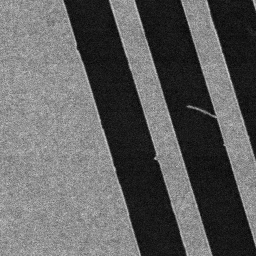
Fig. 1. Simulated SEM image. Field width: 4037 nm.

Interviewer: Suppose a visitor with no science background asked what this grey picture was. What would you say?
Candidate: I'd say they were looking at one or a few lines or trenches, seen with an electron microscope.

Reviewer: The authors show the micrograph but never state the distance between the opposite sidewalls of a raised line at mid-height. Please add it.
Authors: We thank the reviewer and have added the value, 373 nm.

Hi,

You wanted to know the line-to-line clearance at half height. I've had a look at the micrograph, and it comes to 703 nanometers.